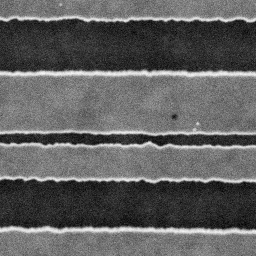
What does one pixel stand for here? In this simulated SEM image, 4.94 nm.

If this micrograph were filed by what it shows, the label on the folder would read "lines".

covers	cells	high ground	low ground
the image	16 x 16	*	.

****************
................
................
................
................
****************
****************
****************
****************
****************
****************
................
................
................
****************
****************